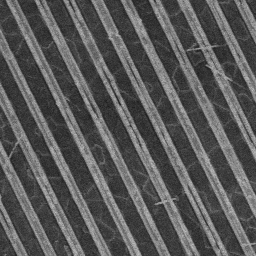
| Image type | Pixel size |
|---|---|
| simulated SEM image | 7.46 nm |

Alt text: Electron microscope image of parallel lines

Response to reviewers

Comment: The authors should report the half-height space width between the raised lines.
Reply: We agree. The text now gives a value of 136 nm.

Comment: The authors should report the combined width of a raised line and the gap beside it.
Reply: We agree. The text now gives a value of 192 nanometers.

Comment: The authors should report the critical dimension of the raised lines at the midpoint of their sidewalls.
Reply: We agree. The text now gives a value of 58.6 nm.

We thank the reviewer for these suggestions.